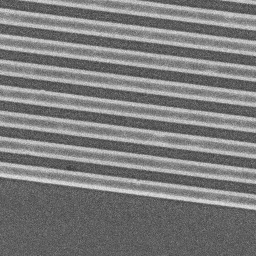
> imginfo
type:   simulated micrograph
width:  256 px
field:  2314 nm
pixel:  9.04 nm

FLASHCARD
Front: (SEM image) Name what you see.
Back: parallel lines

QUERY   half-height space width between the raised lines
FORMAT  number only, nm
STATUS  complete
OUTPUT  114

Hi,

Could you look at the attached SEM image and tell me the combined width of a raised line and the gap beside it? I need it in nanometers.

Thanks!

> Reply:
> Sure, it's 230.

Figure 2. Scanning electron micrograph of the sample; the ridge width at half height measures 0.113 um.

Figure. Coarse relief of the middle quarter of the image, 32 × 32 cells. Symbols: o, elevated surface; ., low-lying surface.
....................oooooooooooo
oo..........................oooo
oooooooooo......................
ooooooooooooooooo...............
..ooooooooooooooooooooooo.......
.........ooooooooooooooooooooooo
.................ooooooooooooooo
.........................ooooooo
ooooooo.........................
ooooooooooooooo.................
oooooooooooooooooooooo..........
.......ooooooooooooooooooooooo..
...............ooooooooooooooooo
......................oooooooooo
oooo..........................oo
oooooooooooo....................
ooooooooooooooooooo.............
..oooooooooooooooooooooooooo....
..........oooooooooooooooooooooo
..................oooooooooooooo
..........................oooooo
oooooooo........................
ooooooooooooooo.................
ooooooooooooooooooooooo.........
........ooooooooooooooooooooooo.
...............ooooooooooooooooo
.......................ooooooooo
ooooo..........................o
ooooooooooooo...................
ooooooooooooooooooooo...........
.....ooooooooooooooooooooooo....
.............ooooooooooooooooooo